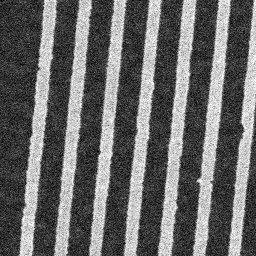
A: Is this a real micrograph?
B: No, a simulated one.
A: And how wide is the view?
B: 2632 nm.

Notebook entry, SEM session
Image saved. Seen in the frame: parallel lines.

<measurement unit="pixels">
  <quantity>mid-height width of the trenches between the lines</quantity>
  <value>23.1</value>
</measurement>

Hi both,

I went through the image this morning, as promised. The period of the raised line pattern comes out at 356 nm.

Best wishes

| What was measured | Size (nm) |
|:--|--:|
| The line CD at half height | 116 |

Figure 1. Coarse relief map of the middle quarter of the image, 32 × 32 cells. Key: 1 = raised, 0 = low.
00111000000111000000110000001110
00111000000111000000110000001110
00111000000111000000110000001110
00111000000110000000110000001110
00111000000110000000110000001110
00111000000110000001110000001110
00111000000110000001110000001110
00111000001110000001110000001110
00110000001110000001110000001110
01110000001110000001110000001110
01110000001110000001110000001100
01110000001110000001110000011100
01110000001110000001100000011100
01110000001100000011100000011100
01110000001100000011100000011100
01110000001100000011100000011100
01110000001100000011100000011100
01110000001100000011100000011100
11110000011100000011100000011000
11100000011100000011100000011000
11100000011100000011100000111000
11100000011100000011000000111000
11100000011100000011000000111000
11100000011100000011000000111000
11100000011100000111000000111000
11100000011000000111000000111000
11100000011000000111000001111000
11000000111000000111000000111000
11000000111000000111000000111000
11000000111000000111000000110000
11000000111000000110000000110000
11000000111000000110000000110000